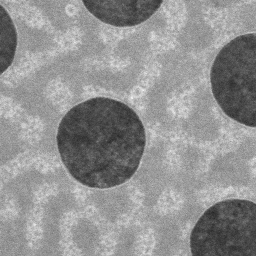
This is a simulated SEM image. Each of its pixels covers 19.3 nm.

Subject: holes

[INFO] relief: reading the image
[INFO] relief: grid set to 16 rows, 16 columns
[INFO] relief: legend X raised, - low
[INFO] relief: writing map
XXXXX-----XXXXXX
-XXXXXX--XXXXXXX
-XXXXXXXXXXXXX--
-XXXXXXXXXXXXX--
XXXXXXXXXXXXX---
XXXXXXXXXXXXX---
XXXXX---XXXXXX--
XXXX-----XXXXXX-
XXXX-----XXXXXXX
XXXX-----XXXXXXX
XXXX-----XXXXXXX
XXXXX---XXXXXXXX
XXXXXXXXXXXXXX-X
XXXXXXXXXXXXX---
XXXXXXXXXXXX----
XXXXXXXXXXXX----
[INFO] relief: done